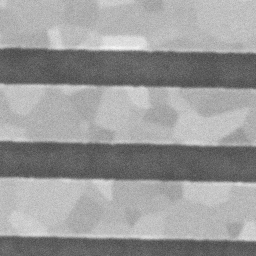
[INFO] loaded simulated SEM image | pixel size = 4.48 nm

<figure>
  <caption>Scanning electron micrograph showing lines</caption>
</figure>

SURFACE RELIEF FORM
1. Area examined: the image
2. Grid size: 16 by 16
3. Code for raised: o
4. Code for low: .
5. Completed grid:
oooooooooooooooo
oooooooooooooooo
oooooooooooooooo
................
................
oooooooooooo....
oooooooooooooooo
oooooooooooooooo
oooooooooooooooo
................
................
oooooooooooooooo
oooooooooooooooo
oooooooooooooooo
oooooooooooooooo
................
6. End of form